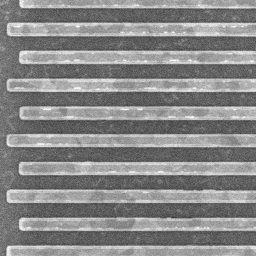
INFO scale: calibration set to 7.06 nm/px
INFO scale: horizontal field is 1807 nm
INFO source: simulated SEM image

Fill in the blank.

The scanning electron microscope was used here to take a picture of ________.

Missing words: parallel lines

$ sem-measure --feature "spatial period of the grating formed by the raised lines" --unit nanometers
197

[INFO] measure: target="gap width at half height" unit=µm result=0.118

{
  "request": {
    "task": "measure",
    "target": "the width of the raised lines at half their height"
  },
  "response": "79.4 nanometers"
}